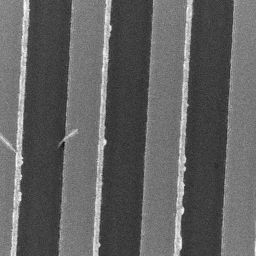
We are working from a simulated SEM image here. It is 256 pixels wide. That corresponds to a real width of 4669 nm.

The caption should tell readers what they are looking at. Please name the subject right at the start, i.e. lines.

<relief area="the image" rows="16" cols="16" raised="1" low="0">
1100011000110001
1100111000110001
1100111001110001
1100111001110011
1100111001110011
1100111001110011
1000111001110011
1000111001110011
1000111001110011
1000110001110011
1000110001110011
1000110001100011
1000110001100011
1000110001100011
1000110001100011
1000110001100011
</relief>